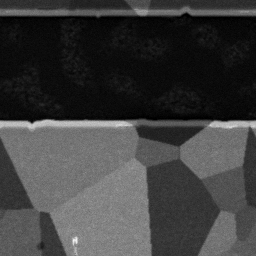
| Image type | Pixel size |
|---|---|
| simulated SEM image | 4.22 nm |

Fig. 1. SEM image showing one or a few lines or trenches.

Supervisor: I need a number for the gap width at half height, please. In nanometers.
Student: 468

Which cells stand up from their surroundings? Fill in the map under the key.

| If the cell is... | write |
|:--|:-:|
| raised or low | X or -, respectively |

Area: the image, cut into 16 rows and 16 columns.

XXXXXXXXXXXXXXXX
----------------
----------------
----------------
----------------
----------------
----------------
----------------
XXXXXXXXXXXXXXXX
XXXXXXXXXXXXXXXX
XXXXXXXXXXXXXXXX
XXXXXXXXXXXXXXXX
XXXXXXXXXXXXXXXX
XXXXXXXXXXXXXXXX
XXXXXXXXXXXXXXXX
XXXXXXXXXXXXXXXX